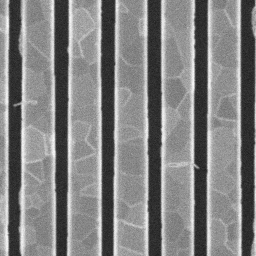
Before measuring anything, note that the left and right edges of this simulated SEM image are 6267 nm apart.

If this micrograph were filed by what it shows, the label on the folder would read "lines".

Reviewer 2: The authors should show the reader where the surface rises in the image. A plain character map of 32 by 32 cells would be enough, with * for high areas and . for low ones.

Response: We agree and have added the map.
*..****..***...***..****..****..
*..****..****..***..****..****..
*..****..***...***..****..****..
*..****..***...***..****..****..
*..****..***...***..****..****..
*..****..***...***..****..****..
*..****..***...***..****..****..
*..****..***...***..****..****..
*..****..***...***..****..****..
*..****..***...***..****..****..
*..****..****..***..****..****..
*..****..***...***..****..****..
*..****..****..***..****..****..
*..****..****..***..****..****..
*..****..****..***..****..****..
*..****..****..***..****..****..
*..****..****..***..****..****..
*..****..****..***..****..****..
*..****..****..***..****..****..
*..****..****..***..****..****..
*..****..****..***..****..****..
*..****..****..***..****..****..
*..****..****.****..****..****..
*..****..****.****..****..****..
*..****..****.****..****..****..
*..****..****.****..****..****..
*..****..****.****..****..****..
*..****..****.****..****..****..
*..****..****.****..****..****..
*..****..****.****..****..****..
*..****..****.****..****..****..
*..****..****.****..****..****..